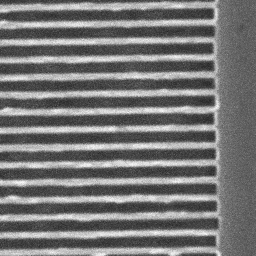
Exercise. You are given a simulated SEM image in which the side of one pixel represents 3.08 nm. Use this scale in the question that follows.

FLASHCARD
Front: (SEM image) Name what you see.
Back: parallel lines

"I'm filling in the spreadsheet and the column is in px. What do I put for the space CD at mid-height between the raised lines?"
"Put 12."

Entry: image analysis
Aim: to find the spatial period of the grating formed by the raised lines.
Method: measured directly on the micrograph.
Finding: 54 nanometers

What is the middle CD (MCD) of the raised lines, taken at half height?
18.5 nm